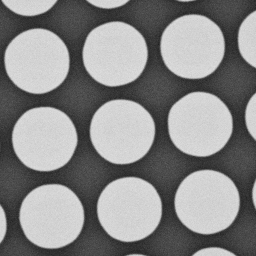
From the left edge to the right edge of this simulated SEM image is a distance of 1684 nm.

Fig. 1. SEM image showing an array of small figures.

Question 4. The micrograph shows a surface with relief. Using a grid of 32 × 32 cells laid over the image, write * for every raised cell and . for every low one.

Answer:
.******.....****................
..****..........................
......................****.....*
............*****....******...**
..*****....*******..********..**
.*******...*******..********..**
.*******..********..********..**
.********.********..********...*
.********..*******...******.....
.*******...******.....****......
..******.....***................
....**..........................
...............*......******...*
.....**.....******...*******...*
...*****....*******..********..*
..*******..********..********..*
..********.********..********..*
..********.********...*******...
..*******...*******...******....
..*******....*****.......*......
...*****........................
........................***.....
...............***.....******...
.....***.....******...********..
...*******...*******..********..
...*******..********..********..
...*******..********..********..
*.********..********...******...
*..*******...******.....****....
*..*******....****..............
....****........................
.........................****...